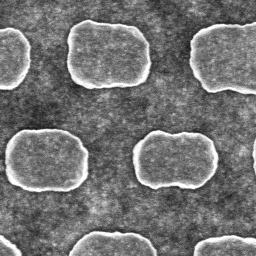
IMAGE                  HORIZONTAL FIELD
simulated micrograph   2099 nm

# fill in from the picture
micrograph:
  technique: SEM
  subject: raised bodies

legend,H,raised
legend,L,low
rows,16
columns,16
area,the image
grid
LLLLLLLLLLLLLLLL
LLLLLHLLLLLLLLLL
HHLLHHHHHLLLHHHH
HHLLHHHHHLLLHHHH
HHLLHHHHHLLLHHHH
HLLLLLLLLLLLLHHH
LLLLLLLLLLLLLLLL
LLLLLLLLLLLLLLLL
LHHHHLLLLHHHHLLL
HHHHHLLLLHHHHLLL
HHHHHLLLHHHHHLLL
LHHHHLLLLHHHHLLL
LLLLLLLLLLLLLLLL
LLLLLLLLLLLLLLLL
LLLLLLLLLLLLLLLL
HLLLLHHHHHLLHHHH